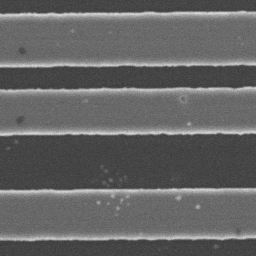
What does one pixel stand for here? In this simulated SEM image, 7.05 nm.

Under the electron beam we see lines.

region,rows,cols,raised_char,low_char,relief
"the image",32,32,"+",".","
................................
..............................+.
++++++++++++++++++++++++++++++++
++++++++++++++++++++++++++++++++
++++++++++++++++++++++++++++++++
++++++++++++++++++++++++++++++++
++++++++++++++++++++++++++++++++
++++++++++++++++++++++++++++++++
................................
................................
................................
++++++++++++++++++++++++++++++++
++++++++++++++++++++++++++++++++
++++++++++++++++++++++++++++++++
++++++++++++++++++++++++++++++++
++++++++++++++++++++++++++++++++
++++++++++++++++++++++++++++++++
................................
................................
................................
................................
................................
................................
................................
++++++++++++++++++++++++++++++++
++++++++++++++++++++++++++++++++
++++++++++++++++++++++++++++++++
++++++++++++++++++++++++++++++++
++++++++++++++++++++++++++++++++
++++++++++++++++++++++++++++++++
................................
................................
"